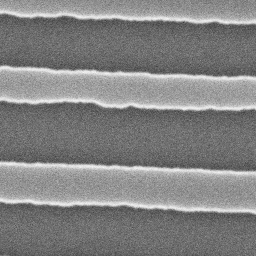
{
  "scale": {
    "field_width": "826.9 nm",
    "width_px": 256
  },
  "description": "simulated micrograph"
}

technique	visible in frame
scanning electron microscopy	lines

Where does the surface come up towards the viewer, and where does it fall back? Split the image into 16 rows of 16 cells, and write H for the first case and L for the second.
HHHHHHHHHHHHHHHH
LLLLLLLLLLLLLLLL
LLLLLLLLLLLLLLLL
LLLLLLLLLLLLLLLL
HHHHHHLLLLLLLLLL
HHHHHHHHHHHHHHHH
LLLLLLHHHHHHHHHH
LLLLLLLLLLLLLLLL
LLLLLLLLLLLLLLLL
LLLLLLLLLLLLLLLL
HHHHHHHHHLLLLLLL
HHHHHHHHHHHHHHHH
HHHHHHHHHHHHHHHH
LLLLLLLLLLLLLLLL
LLLLLLLLLLLLLLLL
LLLLLLLLLLLLLLLL